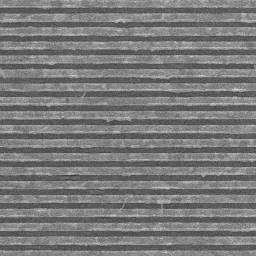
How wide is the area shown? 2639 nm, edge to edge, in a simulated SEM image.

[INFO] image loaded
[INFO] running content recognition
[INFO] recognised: parallel lines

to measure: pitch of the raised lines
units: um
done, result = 0.144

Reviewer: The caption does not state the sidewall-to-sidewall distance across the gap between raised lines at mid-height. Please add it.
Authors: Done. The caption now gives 67 nm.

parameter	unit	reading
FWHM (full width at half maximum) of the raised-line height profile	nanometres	79.9